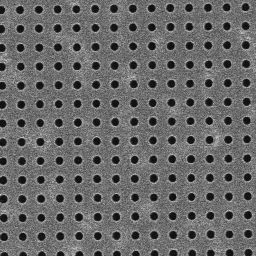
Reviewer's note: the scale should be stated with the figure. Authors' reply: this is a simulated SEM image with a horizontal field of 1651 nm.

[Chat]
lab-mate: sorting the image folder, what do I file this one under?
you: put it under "a regular array of holes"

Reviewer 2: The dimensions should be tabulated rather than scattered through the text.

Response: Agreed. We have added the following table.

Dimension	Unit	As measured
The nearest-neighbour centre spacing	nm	119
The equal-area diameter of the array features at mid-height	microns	0.0494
